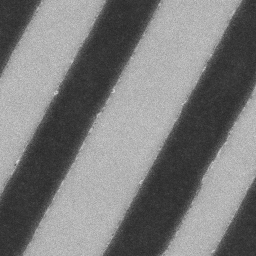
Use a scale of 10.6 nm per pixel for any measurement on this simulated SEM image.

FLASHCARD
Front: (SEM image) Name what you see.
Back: one or a few lines or trenches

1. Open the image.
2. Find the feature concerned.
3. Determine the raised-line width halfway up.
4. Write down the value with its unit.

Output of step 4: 50.8 pixels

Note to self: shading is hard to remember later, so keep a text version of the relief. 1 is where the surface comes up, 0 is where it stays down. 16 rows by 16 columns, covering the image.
1100001111000001
1100001110000011
1000011110000011
1000011100000111
0000111100000111
0000111000001111
0001111000011110
0001110000011110
0011100000111100
0111100000111100
0111000001111000
1111000001111000
1110000011110001
1110000011110001
1100000111100011
1100000111000111